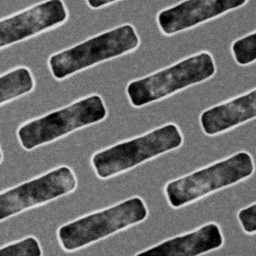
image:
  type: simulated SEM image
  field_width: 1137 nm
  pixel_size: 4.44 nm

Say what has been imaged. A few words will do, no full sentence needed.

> holes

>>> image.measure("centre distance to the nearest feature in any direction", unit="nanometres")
348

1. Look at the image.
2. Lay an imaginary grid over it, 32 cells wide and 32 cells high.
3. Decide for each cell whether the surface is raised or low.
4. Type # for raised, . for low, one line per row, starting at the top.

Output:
#####...###..#########........##
###.....############........####
#.......############......######
......#########.####...#########
....########.....##############.
.#########.......############...
########........#############...
######.......##########...####..
##.###....###########......#####
....###.###########.......######
....############........########
...#############......#########.
.#########...###...##########...
########.....##############.....
######.......############.......
###........##############.....##
##.......##########...####.#####
###....##########......#########
###.##########........##########
############.......##########..#
############.....##########.....
######...###...##########......#
####.....#############........##
##.......############.......####
.......##############....#######
.....##########...###..#########
..##########......############..
##########........############..
########.......##########..####.
#######......##########.....####
#....###...#########........####
.....#############........######